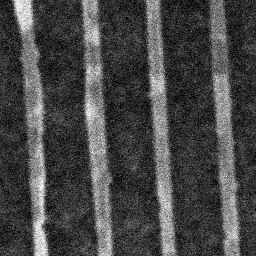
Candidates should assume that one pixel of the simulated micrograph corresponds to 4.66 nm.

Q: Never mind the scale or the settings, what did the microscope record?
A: one or a few lines or trenches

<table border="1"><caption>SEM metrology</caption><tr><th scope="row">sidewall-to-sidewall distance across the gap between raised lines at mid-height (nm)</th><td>238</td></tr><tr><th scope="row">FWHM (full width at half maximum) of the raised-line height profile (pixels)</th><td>12.7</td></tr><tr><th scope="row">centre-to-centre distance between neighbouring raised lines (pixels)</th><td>63.5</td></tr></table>